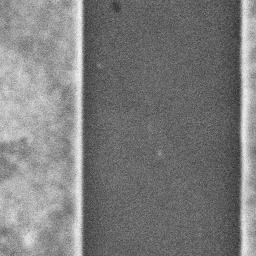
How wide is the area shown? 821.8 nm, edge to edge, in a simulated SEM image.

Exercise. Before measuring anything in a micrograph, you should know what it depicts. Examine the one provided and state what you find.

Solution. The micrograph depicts wiring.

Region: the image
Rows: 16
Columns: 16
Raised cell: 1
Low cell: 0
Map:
1111100000000001
1111100000000001
1111100000000001
1111100000000001
1111100000000001
1111100000000001
1111100000000001
1111100000000001
1111100000000001
1111100000000001
1111100000000001
1111100000000001
1111100000000001
1111100000000001
1111100000000001
1111100000000001